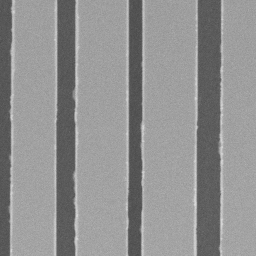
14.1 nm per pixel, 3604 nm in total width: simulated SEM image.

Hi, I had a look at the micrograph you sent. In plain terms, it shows lines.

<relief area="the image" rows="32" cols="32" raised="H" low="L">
LLHHHHHLLHHHHHHHLLHHHHHHHLLLHHHH
LLHHHHHLLHHHHHHHLLHHHHHHHLLLHHHH
LLHHHHHLLHHHHHHHLLHHHHHHHLLLHHHH
LLHHHHHLLHHHHHHHLLHHHHHHHLLLHHHH
LLHHHHHLLHHHHHHHLLHHHHHHHLLLHHHH
LHHHHHHLLHHHHHHHLLHHHHHHHLLLHHHH
LHHHHHHLLHHHHHHHLLHHHHHHHLLLHHHH
LHHHHHHLLHHHHHHHLLHHHHHHHLLLHHHH
LHHHHHHLLHHHHHHHLLHHHHHHHLLLHHHH
LHHHHHHLLHHHHHHHLLHHHHHHHLLLHHHH
LHHHHHHLLHHHHHHHLLHHHHHHHLLLHHHH
LHHHHHHLLHHHHHHHLLHHHHHHHLLLHHHH
LHHHHHHLLHHHHHHHLLHHHHHHHLLLHHHH
LHHHHHHLLHHHHHHHLLHHHHHHHLLLHHHH
LHHHHHHLLHHHHHHHLLHHHHHHHLLLHHHH
LHHHHHHLLHHHHHHHLLHHHHHHHLLLHHHH
LHHHHHHLLHHHHHHHLLHHHHHHHLLLHHHH
LHHHHHHLLHHHHHHHLLHHHHHHHLLLHHHH
LHHHHHHLLHHHHHHHLLHHHHHHHLLLHHHH
LHHHHHHLLHHHHHHHLLHHHHHHHLLLHHHH
LHHHHHHLLHHHHHHHLLHHHHHHHLLLHHHH
LHHHHHHLLHHHHHHHLLHHHHHHHLLLHHHH
LHHHHHHLLHHHHHHHLLHHHHHHHLLLHHHH
LHHHHHHLLHHHHHHHLLHHHHHHHLLLHHHH
LHHHHHHLLHHHHHHHLLHHHHHHHLLLHHHH
LHHHHHHLLHHHHHHHLLHHHHHHHLLLHHHH
LHHHHHHLLHHHHHHHLLHHHHHHHLLLHHHH
LHHHHHHLLHHHHHHHLLHHHHHHHLLLHHHH
LHHHHHHLLHHHHHHHLLHHHHHHHLLLHHHH
LHHHHHHLLHHHHHHHLLHHHHHHHLLLHHHH
LHHHHHHLLHHHHHHHLLHHHHHHHLLLHHHH
LHHHHHHLLHHHHHHHLLHHHHHHHLLLHHHH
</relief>